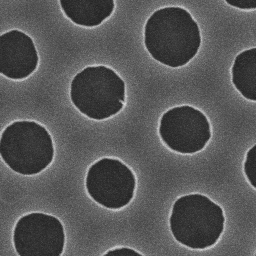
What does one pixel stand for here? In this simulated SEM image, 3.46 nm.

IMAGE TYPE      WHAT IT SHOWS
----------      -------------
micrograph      holes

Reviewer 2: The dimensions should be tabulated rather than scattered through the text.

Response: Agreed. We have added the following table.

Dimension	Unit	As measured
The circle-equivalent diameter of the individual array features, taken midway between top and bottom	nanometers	188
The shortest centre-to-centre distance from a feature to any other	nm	318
